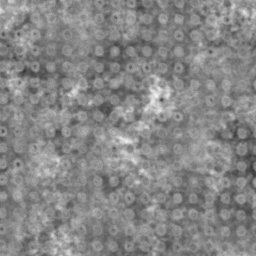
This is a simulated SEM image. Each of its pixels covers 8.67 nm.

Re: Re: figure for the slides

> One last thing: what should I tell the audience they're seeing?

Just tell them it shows a regular array of raised bodies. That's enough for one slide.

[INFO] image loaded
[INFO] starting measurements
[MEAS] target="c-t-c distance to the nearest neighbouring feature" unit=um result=0.137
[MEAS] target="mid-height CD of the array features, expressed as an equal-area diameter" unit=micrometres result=0.0751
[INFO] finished